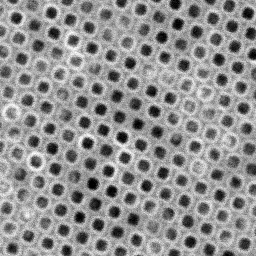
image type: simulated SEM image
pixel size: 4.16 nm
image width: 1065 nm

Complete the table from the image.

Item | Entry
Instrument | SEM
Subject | a regular array of holes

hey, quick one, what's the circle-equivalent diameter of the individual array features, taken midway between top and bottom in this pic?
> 0.0576 um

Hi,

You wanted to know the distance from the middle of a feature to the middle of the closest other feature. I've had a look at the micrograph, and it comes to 20.3 pixels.